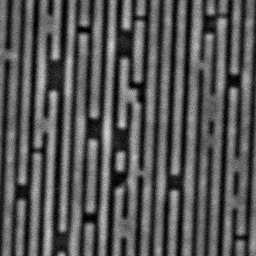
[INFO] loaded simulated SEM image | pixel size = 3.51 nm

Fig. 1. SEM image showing parallel lines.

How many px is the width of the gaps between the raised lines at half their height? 5.13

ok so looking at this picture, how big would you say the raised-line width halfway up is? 0.0303 micrometres